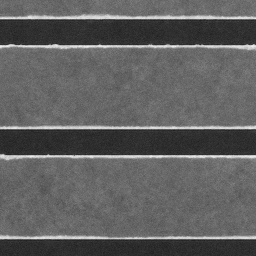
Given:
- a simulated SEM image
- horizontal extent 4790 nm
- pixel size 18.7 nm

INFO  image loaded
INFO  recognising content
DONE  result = lines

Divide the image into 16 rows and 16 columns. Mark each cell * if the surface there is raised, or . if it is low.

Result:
****************
................
................
****************
****************
****************
****************
****************
................
................
****************
****************
****************
****************
****************
................